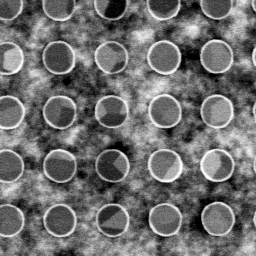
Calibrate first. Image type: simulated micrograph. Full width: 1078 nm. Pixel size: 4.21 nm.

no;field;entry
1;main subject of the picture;a regular array of raised bodies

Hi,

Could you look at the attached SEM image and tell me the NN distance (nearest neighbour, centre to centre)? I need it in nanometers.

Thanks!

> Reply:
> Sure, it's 220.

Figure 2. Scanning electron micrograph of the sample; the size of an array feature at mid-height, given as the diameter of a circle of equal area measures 137 nm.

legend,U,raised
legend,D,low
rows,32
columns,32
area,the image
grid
UUUDDUUUUDDDUUUUDDUUUUDDDUUUUDDD
UUDDDDUUUDDDUUUUDDDUUUDDDUUUUDDD
DDDDDDDDDDDDDDDDDDDDDDDDDDDDDDDD
DDDDDDDDDDDDDDDDDDDDDDDDDDDDDDDD
DDDDDDDDDDDDDDDDDDDDDDDDDDDDDDDD
UUDDDDUUDDDDDUUDDDDUUDDDDDUUDDDD
UUUDDUUUUDDDUUUUDDDUUUDDDUUUUDDD
UUUDDUUUUDDDUUUUDDDUUUDDDUUUUDDD
UUDDDDUUUDDDDUUDDDDUUUDDDDUUUDDD
DDDDDDDDDDDDDDDDDDDDDDDDDDDDDDDD
DDDDDDDDDDDDDDDDDDDDDDDDDDDDDDDD
DDDDDDDDDDDDDDDDDDDDDDDDDDDDDDDD
UUDDDDUUUDDDDUUDDDDUUUDDDDUUDDDD
UUUDDUUUUDDDUUUUDDDUUUDDDUUUUDDD
UUUDDDUUUDDDUUUUDDDUUUUDDUUUUDDD
UUDDDDUUUDDDDUUDDDDUUUDDDDUUDDDD
DDDDDDDDDDDDDDDDDDDDDDDDDDDDDDDD
DDDDDDDDDDDDDDDDDDDDDDDDDDDDDDDD
DDDDDDDDDDDDDDDDDDDDDDDDDDDDDDDD
UUDDDDUUUDDDUUUUDDDUUUDDDDUUUDDD
UUUDDUUUUDDDUUUUDDDUUUUDDUUUUDDD
UUUDDDUUUDDDUUUUDDDUUUDDDUUUUDDD
UUDDDDDUUDDDDUUDDDDDUUDDDDUUDDDD
DDDDDDDDDDDDDDDDDDDDDDDDDDDDDDDD
DDDDDDDDDDDDDDDDDDDDDDDDDDDDDDDD
DDDDDDDDDDDDDDDDDDDDUDDDDDUUDDDD
UUUDDDUUUDDDUUUUDDDUUUDDDUUUUDDD
UUUDDDUUUDDDUUUUDDDUUUUDDUUUUDDD
UUUDDDUUUDDDUUUUDDDUUUDDDDUUUDDD
UDDDDDDUDDDDDDDDDDDDDDDDDDDDDDDD
DDDDDDDDDDDDDDDDDDDDDDDDDDDDDDDD
DDDDDDDDDDDDDDDDDDDDDDDDDDDDDDDD